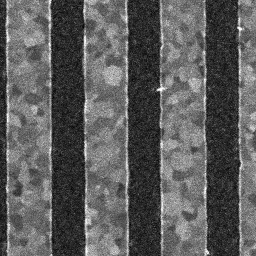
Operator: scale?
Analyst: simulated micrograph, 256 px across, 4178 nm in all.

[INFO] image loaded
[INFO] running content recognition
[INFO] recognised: one or a few lines or trenches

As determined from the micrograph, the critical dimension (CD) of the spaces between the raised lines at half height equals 555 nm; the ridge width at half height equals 704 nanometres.